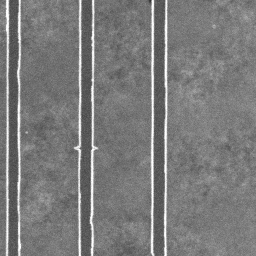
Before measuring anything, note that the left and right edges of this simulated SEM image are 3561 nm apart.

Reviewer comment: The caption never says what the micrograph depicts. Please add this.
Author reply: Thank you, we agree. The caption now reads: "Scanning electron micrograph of one or a few lines or trenches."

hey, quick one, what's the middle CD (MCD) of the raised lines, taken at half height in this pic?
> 179 nanometers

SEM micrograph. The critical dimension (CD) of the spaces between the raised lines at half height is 0.831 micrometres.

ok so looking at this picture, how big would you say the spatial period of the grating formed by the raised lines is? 1010 nm